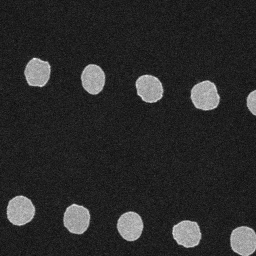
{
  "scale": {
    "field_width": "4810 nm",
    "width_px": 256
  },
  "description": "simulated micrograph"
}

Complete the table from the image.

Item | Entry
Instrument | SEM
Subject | a regular array of raised bodies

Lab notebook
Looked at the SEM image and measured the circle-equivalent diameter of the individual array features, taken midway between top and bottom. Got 504 nm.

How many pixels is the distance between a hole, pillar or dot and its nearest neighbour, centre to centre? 56